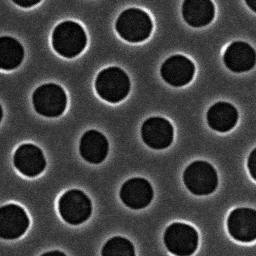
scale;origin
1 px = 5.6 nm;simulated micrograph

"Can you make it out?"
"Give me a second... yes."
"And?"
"a regular array of holes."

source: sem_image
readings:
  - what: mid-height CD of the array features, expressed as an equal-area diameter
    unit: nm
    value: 195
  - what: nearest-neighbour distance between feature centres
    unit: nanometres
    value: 353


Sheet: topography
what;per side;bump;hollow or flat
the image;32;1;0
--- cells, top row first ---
11000111111111111111111000011110
11111111111111100011111000011111
11111111111111100001111000011111
11111110001111000001111111111111
11111100000111100001111111111111
00011100000111111111111111111001
00011110001111111111111111110000
00011111111111111111100011110000
00111111111110011111000011110000
11111111111100001111000011111111
11111101111100001111100111111111
11110000111100001111111111111111
11110000111110011111111111111111
11110000111111111111111111000111
11111001111111111111111111000011
11111111111111111100011111000011
11111111111011111100001111101111
11111111110001111100001111111111
11000111110000111110011111111111
11000011110001111111111111111110
11000011111111111111111100111110
11000111111111111111111000011110
11111111111111110011111000011111
11111111111111100001111000011111
11111111000111100001111111111111
10111110000011110001111111111111
00011110000011111111111111111000
00001111000111111111111111110000
00001111111111111111100011110000
00011111111111111111000001111000
11111111111110000111100001111111
11111100111110000111100011111111